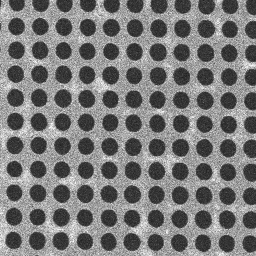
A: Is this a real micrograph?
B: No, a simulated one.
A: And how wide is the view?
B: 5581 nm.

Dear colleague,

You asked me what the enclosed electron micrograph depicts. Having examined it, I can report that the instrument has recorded a regular array of holes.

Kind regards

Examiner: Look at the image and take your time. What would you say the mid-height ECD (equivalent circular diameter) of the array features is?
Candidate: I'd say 17.5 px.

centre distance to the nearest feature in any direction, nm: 507